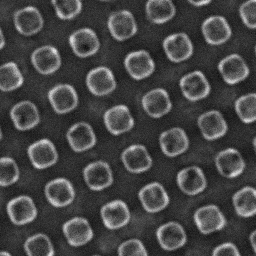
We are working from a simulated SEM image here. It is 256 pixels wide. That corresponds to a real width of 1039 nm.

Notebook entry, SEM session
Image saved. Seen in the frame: a regular array of raised bodies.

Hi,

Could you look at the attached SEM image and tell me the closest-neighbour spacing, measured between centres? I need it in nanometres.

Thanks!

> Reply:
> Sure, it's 169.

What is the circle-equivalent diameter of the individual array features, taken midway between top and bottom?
110 nm